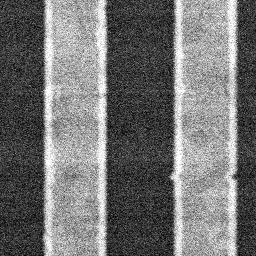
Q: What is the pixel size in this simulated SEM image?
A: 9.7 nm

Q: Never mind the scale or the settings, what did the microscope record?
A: one or a few lines or trenches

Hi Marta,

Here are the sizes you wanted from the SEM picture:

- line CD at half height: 512 nanometres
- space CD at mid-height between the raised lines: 747 nm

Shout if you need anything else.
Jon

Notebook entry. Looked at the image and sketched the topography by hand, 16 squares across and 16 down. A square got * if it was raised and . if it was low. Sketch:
...***.....***..
...***.....***..
...***.....***..
...***.....***..
...***.....***..
...***.....***..
...***.....***..
...***.....***..
...***.....***..
...***.....***..
...***.....***..
...***.....***..
...***.....***..
...***.....***..
...***.....***..
...***.....***..